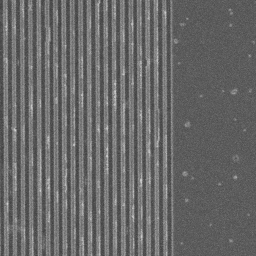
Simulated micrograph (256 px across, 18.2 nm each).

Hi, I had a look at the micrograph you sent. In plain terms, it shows parallel lines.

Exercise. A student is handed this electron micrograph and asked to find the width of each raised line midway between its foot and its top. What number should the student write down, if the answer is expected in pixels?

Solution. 3.75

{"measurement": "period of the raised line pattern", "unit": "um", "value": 0.152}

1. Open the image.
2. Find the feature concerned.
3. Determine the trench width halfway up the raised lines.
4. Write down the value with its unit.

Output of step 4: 84.2 nm